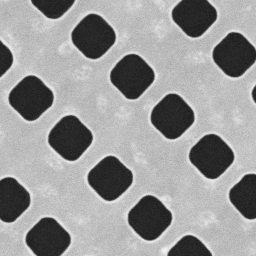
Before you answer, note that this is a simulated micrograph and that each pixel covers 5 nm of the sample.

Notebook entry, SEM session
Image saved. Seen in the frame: a regular array of holes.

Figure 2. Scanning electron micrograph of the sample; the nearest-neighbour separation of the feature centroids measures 280 nm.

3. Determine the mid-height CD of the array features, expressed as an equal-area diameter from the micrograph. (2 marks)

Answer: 212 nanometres